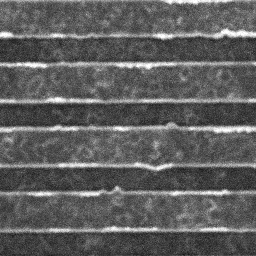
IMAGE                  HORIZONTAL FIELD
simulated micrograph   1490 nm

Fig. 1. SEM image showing one or a few lines or trenches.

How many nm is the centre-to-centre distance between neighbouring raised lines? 376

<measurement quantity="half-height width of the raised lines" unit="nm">225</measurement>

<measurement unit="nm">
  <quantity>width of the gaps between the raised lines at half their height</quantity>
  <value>153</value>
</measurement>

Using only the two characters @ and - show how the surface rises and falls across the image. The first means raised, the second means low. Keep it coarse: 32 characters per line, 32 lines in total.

@@@@@@@@@@@@@@@@@@@@@@@@@@@@@@@@
@@@@@@@@@@@@@@@@@@@@@@@@@@@@@@@@
@@@@@@@@@@@@@@@@@@@@@@@@@@@@@@@@
@@@@@@@@@@@@@@@@@@@@@@@@@@@@@@@@
@@@@@@@@@@@-@------@@@----@@----
--------------------------------
--------------------------------
--------------------------------
@@@@@@@@@@@@@@@@@@@@@@@@@@@@@@@@
@@@@@@@@@@@@@@@@@@@@@@@@@@@@@@@@
@@@@@@@@@@@@@@@@@@@@@@@@@@@@@@@@
@@@@@@@@@@@@@@@@@@@@@@@@@@@@@@@@
@@@@@@@@@@@@@@@@@@@@@@@@@@@@@@@@
--------------------------------
--------------------------------
--------------------------------
@@@@@@@@@@@@@@@@@@@@@@@@@@@@@@@@
@@@@@@@@@@@@@@@@@@@@@@@@@@@@@@@@
@@@@@@@@@@@@@@@@@@@@@@@@@@@@@@@@
@@@@@@@@@@@@@@@@@@@@@@@@@@@@@@@@
@@@@@@@@@@@@@@@@@@@@@@@@@@@@@@@@
--------------------------------
--------------------------------
--------------------------------
@@@@@@@@@@@@@@@@@@@@@@@@@@@@@@@@
@@@@@@@@@@@@@@@@@@@@@@@@@@@@@@@@
@@@@@@@@@@@@@@@@@@@@@@@@@@@@@@@@
@@@@@@@@@@@@@@@@@@@@@@@@@@@@@@@@
@@@@@@@@@@@@@@@@@@@@@@@@@@@@@@@@
--------------------------------
--------------------------------
--------------------------------